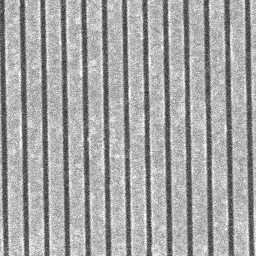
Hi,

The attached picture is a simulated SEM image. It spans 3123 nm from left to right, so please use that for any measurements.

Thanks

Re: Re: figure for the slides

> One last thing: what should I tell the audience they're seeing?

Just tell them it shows parallel lines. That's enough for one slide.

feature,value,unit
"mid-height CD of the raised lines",171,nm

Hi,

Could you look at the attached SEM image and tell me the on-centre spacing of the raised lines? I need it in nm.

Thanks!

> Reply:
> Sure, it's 250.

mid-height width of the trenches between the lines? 6.5 pixels